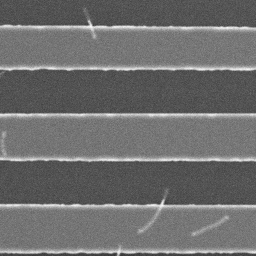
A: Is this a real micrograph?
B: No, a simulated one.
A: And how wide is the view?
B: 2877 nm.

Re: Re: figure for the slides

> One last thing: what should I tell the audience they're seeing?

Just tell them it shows lines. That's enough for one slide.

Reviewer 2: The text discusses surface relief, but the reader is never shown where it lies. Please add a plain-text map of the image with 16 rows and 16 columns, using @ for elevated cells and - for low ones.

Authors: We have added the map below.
----------------
----------------
@@@@@@@@@@@@@@@@
@@@@@@@@@@@@@@@@
----------------
----------------
----------------
@@@@@@@@@@@@@@@@
@@@@@@@@@@@@@@@@
@@@@@@@@@@@@@@@@
----------------
----------------
----------------
@@@@@@@@@@@@@@@@
@@@@@@@@@@@@@@@@
@@@@@@@@@@@@@@@@